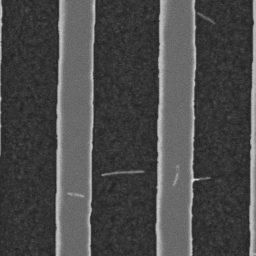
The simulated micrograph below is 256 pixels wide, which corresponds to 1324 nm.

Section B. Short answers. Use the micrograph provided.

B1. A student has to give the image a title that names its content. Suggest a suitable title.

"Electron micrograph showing lines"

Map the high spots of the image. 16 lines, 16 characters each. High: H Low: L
LLLLHHLLLLHHLLLL
LLLLHHLLLLHHLLLL
LLLLHHLLLLHHLLLL
LLLLHHLLLLHHLLLL
LLLLHHLLLLHHLLLL
LLLLHHLLLLHHLLLL
LLLLHHLLLLHHLLLL
LLLLHHLLLLHHLLLL
LLLLHHLLLLHHLLLL
LLLLHHLLLLHHLLLL
LLLLHHLLLLHHLLLL
LLLLHHLLLLHHLLLL
LLLLHHLLLLHHLLLL
LLLLHHLLLLHHLLLL
LLLLHHLLLLHHLLLL
LLLLHHLLLLHHLLLL